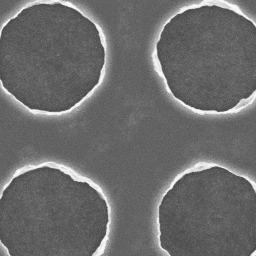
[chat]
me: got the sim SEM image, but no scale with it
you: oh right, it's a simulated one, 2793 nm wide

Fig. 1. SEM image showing holes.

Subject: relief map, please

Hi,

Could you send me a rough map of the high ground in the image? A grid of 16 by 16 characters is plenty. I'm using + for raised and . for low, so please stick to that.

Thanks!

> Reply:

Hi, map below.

++...+++++++...+
......++++......
......++++......
.......+++......
......++++......
......+++++.....
+....+++++++...+
++++++++++++++++
++++++++++++++++
++++++++++++++++
++..++++++++..++
+....++++++.....
.......+++......
.......+++......
.......+++......
......++++......